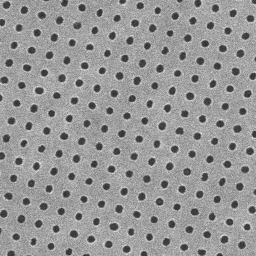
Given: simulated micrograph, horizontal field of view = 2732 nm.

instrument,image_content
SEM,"a regular array of holes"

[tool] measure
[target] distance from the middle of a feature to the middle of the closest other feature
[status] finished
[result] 193 nanometers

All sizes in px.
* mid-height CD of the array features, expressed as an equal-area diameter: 7.74